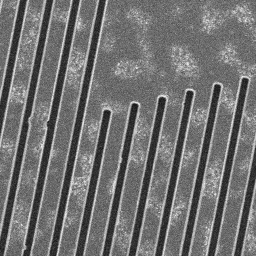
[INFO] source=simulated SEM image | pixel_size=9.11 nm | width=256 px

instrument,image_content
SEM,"parallel lines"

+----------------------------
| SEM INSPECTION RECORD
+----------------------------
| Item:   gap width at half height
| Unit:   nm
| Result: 71.5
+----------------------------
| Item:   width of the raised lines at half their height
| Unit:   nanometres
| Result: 168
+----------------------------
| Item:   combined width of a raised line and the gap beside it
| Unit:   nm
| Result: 236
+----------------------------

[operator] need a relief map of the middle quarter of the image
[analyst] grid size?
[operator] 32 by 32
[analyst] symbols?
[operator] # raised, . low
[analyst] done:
.####...########################
.####..#########################
#####..#########################
#####..#########################
#####..#########################
####...#########################
####..#########################.
####..########################..
####..##################.#####..
####..#################..#####..
###...###########..####..#####..
###..#####.#####...####..#####..
###..#####..####..#####..#####..
###..####...####..#####..####..#
###..####..#####..####...####..#
##...####..#####..####..#####..#
##..#####..#####..####..#####..#
##..#####..####..#####..#####..#
##..####...####..#####..####..##
##..####..#####..####...####..##
##..####..#####..####..#####..##
#..#####..#####..####..#####..##
#..#####..####..#####..#####..##
#..####...####..#####..####..###
#..####..#####..####...####..###
#..####..#####..####..#####..###
..#####..#####..####..#####..###
..#####..####..#####..#####..###
..####...####..#####..####..####
..####..#####..####...####..####
..####..#####..####..#####..####
.#####..#####..####..#####..####